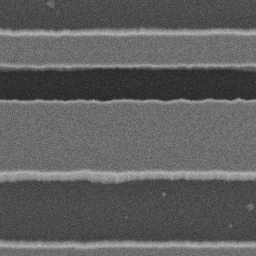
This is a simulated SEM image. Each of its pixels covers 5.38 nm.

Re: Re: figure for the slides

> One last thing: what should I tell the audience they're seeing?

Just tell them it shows lines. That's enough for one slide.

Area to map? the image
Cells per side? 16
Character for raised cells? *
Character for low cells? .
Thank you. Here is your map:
................
................
****************
****************
................
................
****************
****************
****************
****************
****************
................
................
................
................
****************